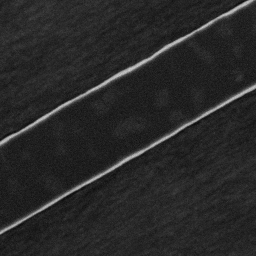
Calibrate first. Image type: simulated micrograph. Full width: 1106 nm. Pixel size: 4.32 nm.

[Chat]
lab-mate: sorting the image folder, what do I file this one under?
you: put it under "one or a few lines or trenches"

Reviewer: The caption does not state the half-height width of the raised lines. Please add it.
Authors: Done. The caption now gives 78.9 pixels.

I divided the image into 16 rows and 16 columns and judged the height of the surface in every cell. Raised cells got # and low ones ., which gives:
...............#
.............###
...........#####
..........######
........########
......##########
....##########..
..##########....
.##########.....
#########.......
#######.........
#####...........
####............
##..............
................
................